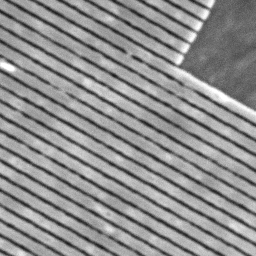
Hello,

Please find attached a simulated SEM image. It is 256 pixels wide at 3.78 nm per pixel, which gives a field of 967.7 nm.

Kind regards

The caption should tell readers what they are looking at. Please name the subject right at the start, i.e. parallel lines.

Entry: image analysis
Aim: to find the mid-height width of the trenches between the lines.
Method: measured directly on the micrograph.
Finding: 9.9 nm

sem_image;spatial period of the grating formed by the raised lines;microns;0.0491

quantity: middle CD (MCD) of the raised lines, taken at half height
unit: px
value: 10.2